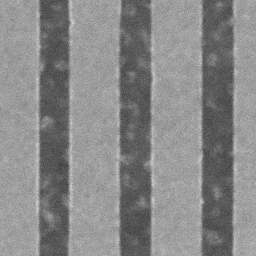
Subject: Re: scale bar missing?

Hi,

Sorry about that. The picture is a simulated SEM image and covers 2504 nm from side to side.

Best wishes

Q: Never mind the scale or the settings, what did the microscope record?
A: one or a few lines or trenches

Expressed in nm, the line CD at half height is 483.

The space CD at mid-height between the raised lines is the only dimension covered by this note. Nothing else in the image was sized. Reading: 0.32 micrometres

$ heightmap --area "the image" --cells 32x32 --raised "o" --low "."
ooooo....oooooo....oooooo....ooo
ooooo....oooooo....oooooo....ooo
ooooo....oooooo....oooooo....ooo
ooooo....oooooo....oooooo....ooo
ooooo....oooooo....oooooo....ooo
ooooo....oooooo....oooooo....ooo
ooooo....oooooo....oooooo....ooo
ooooo....oooooo....oooooo....ooo
ooooo....oooooo....oooooo....ooo
ooooo....oooooo....oooooo....ooo
ooooo....oooooo....oooooo....ooo
ooooo....oooooo....oooooo....ooo
ooooo....oooooo....oooooo....ooo
ooooo....oooooo....oooooo....ooo
ooooo....oooooo....oooooo....ooo
ooooo....oooooo....oooooo....ooo
ooooo....oooooo....oooooo....ooo
ooooo....oooooo....oooooo....ooo
ooooo....oooooo....oooooo....ooo
ooooo....oooooo....oooooo....ooo
ooooo....oooooo....oooooo....ooo
ooooo....oooooo....oooooo....ooo
ooooo....oooooo....oooooo....ooo
ooooo....oooooo....oooooo....ooo
ooooo....oooooo....oooooo....ooo
ooooo....oooooo....oooooo....ooo
ooooo....oooooo....oooooo....ooo
ooooo....oooooo....oooooo....ooo
ooooo....oooooo....oooooo....ooo
ooooo....oooooo....oooooo....ooo
ooooo....oooooo....oooooo....ooo
ooooo....oooooo....oooooo....ooo